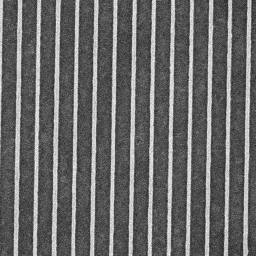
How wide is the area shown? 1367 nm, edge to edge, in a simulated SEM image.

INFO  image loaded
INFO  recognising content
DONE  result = parallel lines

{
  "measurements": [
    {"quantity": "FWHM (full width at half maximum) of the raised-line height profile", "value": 17.4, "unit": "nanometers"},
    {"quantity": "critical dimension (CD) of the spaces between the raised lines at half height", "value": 82.8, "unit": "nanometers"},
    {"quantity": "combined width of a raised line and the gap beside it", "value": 102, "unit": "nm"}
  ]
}